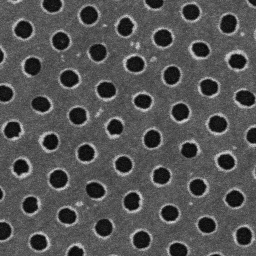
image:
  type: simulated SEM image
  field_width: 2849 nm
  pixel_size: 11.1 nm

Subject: a regular array of holes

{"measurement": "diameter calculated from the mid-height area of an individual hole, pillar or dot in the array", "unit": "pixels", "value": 17.5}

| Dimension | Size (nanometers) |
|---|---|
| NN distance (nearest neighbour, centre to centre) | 421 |